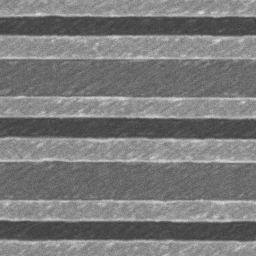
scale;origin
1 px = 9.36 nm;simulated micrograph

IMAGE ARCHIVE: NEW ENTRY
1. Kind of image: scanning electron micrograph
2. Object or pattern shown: lines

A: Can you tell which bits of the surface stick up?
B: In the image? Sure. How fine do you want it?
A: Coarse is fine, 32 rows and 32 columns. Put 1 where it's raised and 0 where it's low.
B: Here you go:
11111111111111111111111111111111
11111111111111111111111111111111
00000000000000000000000000000000
00000000000000000000000000000000
00000000000000000000000000000000
11111111111111111111111111111111
11111111111111111111111111111111
00000000000000000000000000000000
00000000000000000000000000000000
00000000000000000000000000000000
00000000000000000000000000000000
00000000000000000000000000000000
11111111111111111111111111111111
11111111111111111111111111111111
11111111111111111111111111111111
00000000000000000000000000000000
00000000000000000000000000000000
11111111111111111110110000000000
11111111111111111111111111111111
11111111111111111111111111111111
00000000000000000000000000000000
00000000000000000000000000000000
00000000000000000000000000000000
00000000000000000000000000000000
00000000000000000000000000000000
11111111111111111111111111111111
11111111111111111111111111111111
11111111111111111111111111111111
00000000000000000000000000000000
00000000000000000000000000000000
11111111111111111111111111111111
11111111111111111111111111111111